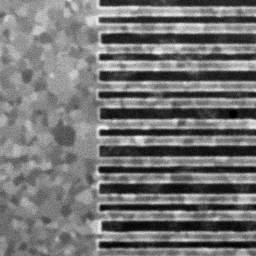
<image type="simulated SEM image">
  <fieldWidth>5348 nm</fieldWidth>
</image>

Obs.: parallel lines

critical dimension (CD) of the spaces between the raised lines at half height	0.209	micrometres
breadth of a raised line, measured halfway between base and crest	157	nanometres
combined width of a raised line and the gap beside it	18.7	px